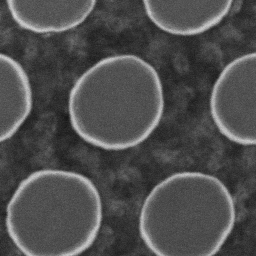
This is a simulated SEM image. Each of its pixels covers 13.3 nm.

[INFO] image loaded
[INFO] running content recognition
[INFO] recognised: raised bodies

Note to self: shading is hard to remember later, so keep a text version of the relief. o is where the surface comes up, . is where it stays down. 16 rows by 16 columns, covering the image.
.ooooo...ooooo..
.oooo.....ooo...
................
...............o
o....ooooo....oo
oo...ooooo...ooo
oo..oooooo...ooo
o...oooooo....oo
.....oooo.....oo
................
................
.ooooo....oooo..
.ooooo...ooooo..
.ooooo...oooooo.
.ooooo...ooooo..
.oooo....ooooo..